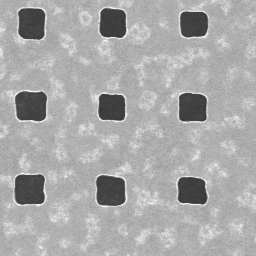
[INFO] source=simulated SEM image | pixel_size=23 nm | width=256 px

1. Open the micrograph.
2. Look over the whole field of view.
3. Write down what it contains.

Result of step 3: a regular array of holes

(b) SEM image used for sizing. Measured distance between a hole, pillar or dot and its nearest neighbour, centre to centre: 1860 nm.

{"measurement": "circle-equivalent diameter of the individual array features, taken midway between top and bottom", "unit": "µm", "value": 0.71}